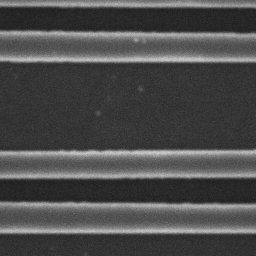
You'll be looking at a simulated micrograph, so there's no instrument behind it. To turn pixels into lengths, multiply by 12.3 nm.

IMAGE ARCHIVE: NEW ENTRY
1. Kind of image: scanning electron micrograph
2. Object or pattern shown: lines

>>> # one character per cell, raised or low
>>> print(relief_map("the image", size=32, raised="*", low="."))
********************************
................................
................................
................................
********************************
********************************
********************************
********************************
................................
................................
................................
................................
................................
................................
................................
................................
................................
................................
................................
********************************
********************************
********************************
................................
................................
................................
*********************.**........
********************************
********************************
********************************
................................
................................
................................